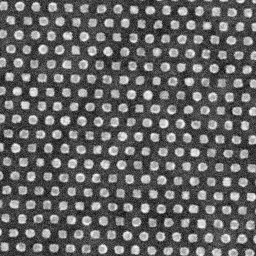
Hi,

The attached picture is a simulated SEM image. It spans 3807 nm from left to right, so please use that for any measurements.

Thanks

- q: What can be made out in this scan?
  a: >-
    a regular array of raised bodies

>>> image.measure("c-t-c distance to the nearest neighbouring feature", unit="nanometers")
235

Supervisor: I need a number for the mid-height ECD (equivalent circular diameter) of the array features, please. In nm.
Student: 114